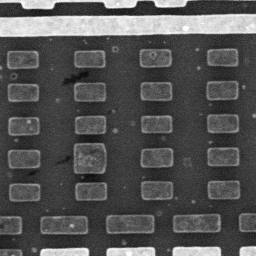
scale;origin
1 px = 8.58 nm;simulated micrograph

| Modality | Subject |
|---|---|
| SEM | wiring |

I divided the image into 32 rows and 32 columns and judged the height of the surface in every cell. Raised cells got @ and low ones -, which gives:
---@@@@------@@@@--@@@@---------
--------------------------------
@@@@@@@@@@@@@@@@@@@@@@@@@@@@@@@@
@@@@@@@@@@@@@@@@@@@@@@@@@@@@@@@@
--------------------------------
--------------------------------
-@@@------@@@-----@@@-----@@@@--
-@@@@----@@@@-----@@@-----@@@@--
-@@@----------------------------
--------------------------------
----------@@@-----@@@-----@@@@--
-@@@@----@@@@-----@@@-----@@@@--
-@@@------@@@-------------------
--------------------------------
--------------------@-----@@@---
-@@@@----@@@@-----@@@-----@@@@--
-@@@@-----@@@-----@@@-----@@@---
--------------------------------
---------@@@@-------------------
-@@@@----@@@@-----@@@-----@@@@--
-@@@@----@@@@-----@@@-----@@@@--
---------@@@@-------------------
--------------------------------
-@@@@----@@@@-----@@@-----@@@@--
-@@@@----@@@@-----@@@-----@@@@--
--------------------------------
--------------------------------
@@@--@@@@@@--@@@@@@---@@@@@---@@
@@@--@@@@@@--@@@@@@---@@@@@---@@
--------------------------------
--------------------------------
@@---@@@@@@--@@@@@@---@@@@@---@@